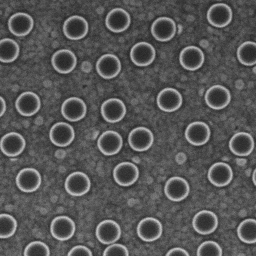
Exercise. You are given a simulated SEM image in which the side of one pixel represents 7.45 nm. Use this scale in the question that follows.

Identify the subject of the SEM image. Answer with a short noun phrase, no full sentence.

a regular array of raised bodies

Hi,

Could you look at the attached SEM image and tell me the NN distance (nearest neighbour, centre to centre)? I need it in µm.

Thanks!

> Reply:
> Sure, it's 0.292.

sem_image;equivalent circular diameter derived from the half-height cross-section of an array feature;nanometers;175